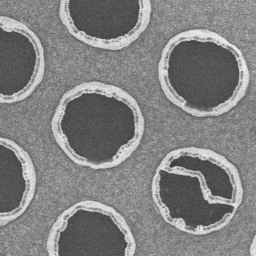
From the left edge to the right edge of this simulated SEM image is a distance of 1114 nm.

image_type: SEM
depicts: raised bodies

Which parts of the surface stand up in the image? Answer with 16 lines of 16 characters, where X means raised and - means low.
----XXXXX-------
X---XXXXX-------
XX---XXX---XXX--
XXX-------XXXXX-
XXX-------XXXXX-
XX---XX---XXXXX-
----XXXX---XXXX-
---XXXXXX-------
----XXXXX-------
X---XXXX---XX---
XX--------XXXX--
XX----------XXX-
XX-----------XX-
X---XXX---------
---XXXXX--------
---XXXXX--------